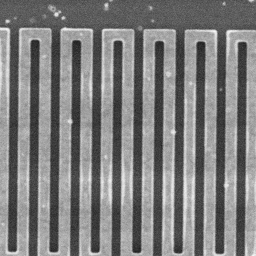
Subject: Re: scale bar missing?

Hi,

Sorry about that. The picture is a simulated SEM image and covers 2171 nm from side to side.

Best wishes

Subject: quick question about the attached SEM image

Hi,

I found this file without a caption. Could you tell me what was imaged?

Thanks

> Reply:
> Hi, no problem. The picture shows groups of lines, slits or small figures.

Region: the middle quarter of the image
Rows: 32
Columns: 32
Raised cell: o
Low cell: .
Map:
oo..ooo...oo...oo...oo...ooo..oo
oo..ooo...oo...oo...oo...ooo..oo
oo..ooo...oo...oo...oo...ooo..oo
oo...oo...oo...oo...oo...ooo..oo
oo...oo...oo...oo...oo...ooo..oo
oo...oo...oo...oo...oo...ooo..oo
oo..ooo...oo...oo...oo...ooo..oo
oo..ooo...oo...oo...oo...ooo..oo
oo..ooo...oo...oo...oo...ooo..oo
oo..ooo...oo...oo...oo...oo...oo
oo..ooo...oo...oo...oo...oo...oo
oo..ooo...oo...oo...oo...oo...oo
oo..ooo..ooo...oo...oo...oo...oo
oo..ooo..ooo...oo...oo...oo...oo
oo..ooo..ooo...oo...oo...oo...oo
o...ooo..ooo...oo...oo...oo...oo
o...ooo..ooo...oo...oo...ooo..oo
o...ooo..ooo...oo...oo...ooo..oo
o...ooo..ooo...oo...oo...oo...oo
o...ooo..ooo...oo...oo...oo...oo
o...ooo..ooo...oo...oo...oo...oo
o...ooo..ooo...oo...oo...oo...oo
o...ooo..ooo...oo...oo...oo...oo
o...ooo..ooo...oo...oo...oo...oo
o...ooo..ooo...oo...oo...oo...oo
o...ooo..ooo...oo...oo...oo...oo
o...ooo..ooo...oo...oo...oo...oo
o...ooo...oo...oo...oo...oo...oo
o...ooo...oo...oo...oo...oo...oo
o...ooo...oo...oo...oo...oo...oo
o...ooo...oo...oo...oo...oo...oo
o...ooo...oo...oo...oo...oo...oo